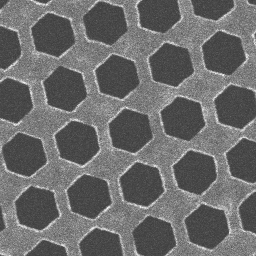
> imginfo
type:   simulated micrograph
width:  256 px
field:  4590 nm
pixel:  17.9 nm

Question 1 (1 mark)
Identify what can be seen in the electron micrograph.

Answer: a regular array of holes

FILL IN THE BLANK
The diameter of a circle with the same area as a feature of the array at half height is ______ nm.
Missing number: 766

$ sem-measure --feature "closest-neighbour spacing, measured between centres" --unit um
0.965